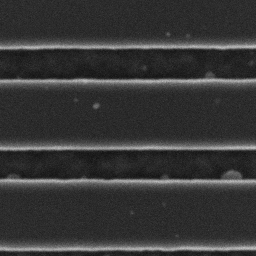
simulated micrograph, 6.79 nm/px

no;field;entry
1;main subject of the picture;lines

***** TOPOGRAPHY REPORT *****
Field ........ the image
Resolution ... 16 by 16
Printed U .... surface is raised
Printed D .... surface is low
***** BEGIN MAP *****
UUUUUUUUUUUUUUUU
UUUUUUUUUUUUUUUU
UUUUUUUUUUUUUUUU
DDDDDDDDDDDDDDDD
DDDDDDDDDDDDDDDD
UUUUUUUUUUUUUUUU
UUUUUUUUUUUUUUUU
UUUUUUUUUUUUUUUU
UUUUUUUUUUUUUUUU
DDDDDDDDDDDDDDDD
DDDDDDDDDDDDDDDD
UUUUUUUUUUUUUUUU
UUUUUUUUUUUUUUUU
UUUUUUUUUUUUUUUU
UUUUUUUUUUUUUUUU
UUUUUUUUUUUUUUUU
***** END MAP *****